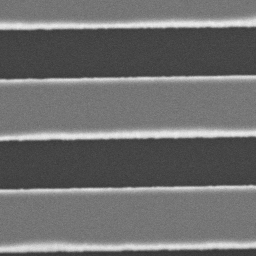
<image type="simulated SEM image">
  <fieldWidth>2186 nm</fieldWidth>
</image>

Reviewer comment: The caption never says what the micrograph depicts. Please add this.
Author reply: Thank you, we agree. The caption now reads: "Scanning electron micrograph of lines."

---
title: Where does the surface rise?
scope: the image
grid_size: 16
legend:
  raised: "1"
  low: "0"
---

1111111111111111
1111111111111111
0000000000000000
0000000000000000
0000000000000000
1111111111111111
1111111111111111
1111111111111111
1111111111111100
0000000000000000
0000000000000000
0000000000000000
1111111111111111
1111111111111111
1111111111111111
1111111111111110